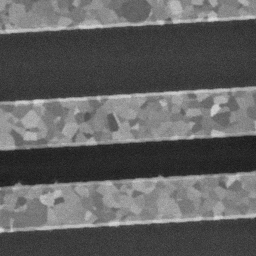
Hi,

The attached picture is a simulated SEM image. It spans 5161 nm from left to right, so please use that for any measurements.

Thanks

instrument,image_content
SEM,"lines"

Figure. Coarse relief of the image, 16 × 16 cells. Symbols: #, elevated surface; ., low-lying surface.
################
#########.......
................
................
................
................
################
################
#############...
................
................
....############
################
################
................
................